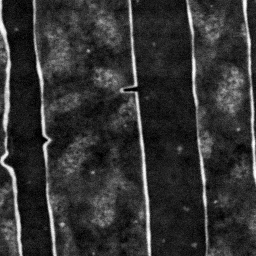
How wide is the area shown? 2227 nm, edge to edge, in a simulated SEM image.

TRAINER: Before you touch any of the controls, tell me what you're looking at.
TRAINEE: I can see one or a few lines or trenches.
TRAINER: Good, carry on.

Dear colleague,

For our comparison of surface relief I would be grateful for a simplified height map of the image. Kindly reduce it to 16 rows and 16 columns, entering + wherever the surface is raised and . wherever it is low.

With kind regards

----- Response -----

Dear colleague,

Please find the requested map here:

..++++++....+++.
..++++++....+++.
..++++++....++++
+.++++++....++++
+.++++++....++++
+..+++++....++++
+..++++++...++++
...++++++...++++
...++++++...++++
...++++++...++++
+..++++++....+++
+..++++++....+++
+..++++++....+++
+..++++++....+++
+..++++++....+++
+..++++++....+++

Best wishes